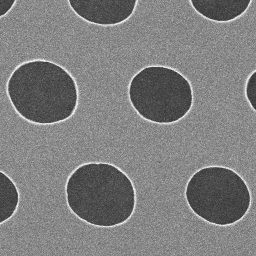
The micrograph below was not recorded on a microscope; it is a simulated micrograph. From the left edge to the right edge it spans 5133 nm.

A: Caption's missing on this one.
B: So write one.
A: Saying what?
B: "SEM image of holes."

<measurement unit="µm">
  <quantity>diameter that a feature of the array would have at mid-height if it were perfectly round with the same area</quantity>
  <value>1.26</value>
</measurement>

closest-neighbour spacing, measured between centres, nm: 2340